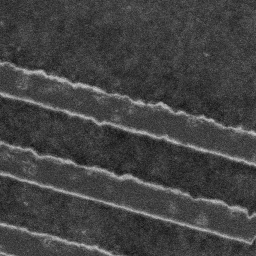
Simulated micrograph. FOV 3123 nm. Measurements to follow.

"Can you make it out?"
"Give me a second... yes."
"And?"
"one or a few lines or trenches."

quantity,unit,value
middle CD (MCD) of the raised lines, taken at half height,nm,366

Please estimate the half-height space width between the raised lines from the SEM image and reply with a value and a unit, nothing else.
579 nanometers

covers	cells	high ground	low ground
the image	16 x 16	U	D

DDDDDDDDDDDDDDDD
DDDDDDDDDDDDDDDD
DDDDDDDDDDDDDDDD
DDDDDDDDDDDDDDDD
UUDDDDDDDDDDDDDD
UUUUUUDDDDDDDDDD
DDUUUUUUUDDDDDDD
DDDDDDUUUUUUUDDD
DDDDDDDDDDUUUUUU
UUDDDDDDDDDDDUUU
UUUUUUDDDDDDDDDD
DDUUUUUUUDDDDDDD
DDDDDDUUUUUUUDDD
DDDDDDDDDDUUUUUU
UUDDDDDDDDDDDUUU
UUUUUUDDDDDDDDDD